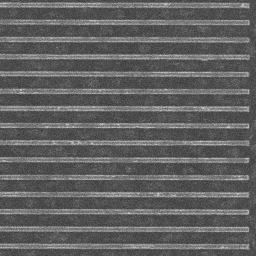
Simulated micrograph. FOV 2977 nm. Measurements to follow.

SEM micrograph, parallel lines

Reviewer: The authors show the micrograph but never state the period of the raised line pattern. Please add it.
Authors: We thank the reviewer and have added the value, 200 nm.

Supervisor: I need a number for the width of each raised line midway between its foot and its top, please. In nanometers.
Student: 53.8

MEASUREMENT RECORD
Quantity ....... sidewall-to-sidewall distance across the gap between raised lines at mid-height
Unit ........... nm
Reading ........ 150